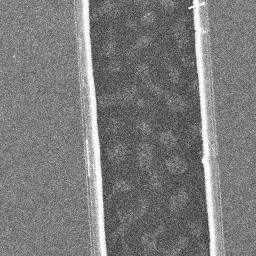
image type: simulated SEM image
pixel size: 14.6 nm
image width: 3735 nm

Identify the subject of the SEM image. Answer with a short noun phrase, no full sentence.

one or a few lines or trenches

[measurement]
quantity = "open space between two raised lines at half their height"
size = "1570 nm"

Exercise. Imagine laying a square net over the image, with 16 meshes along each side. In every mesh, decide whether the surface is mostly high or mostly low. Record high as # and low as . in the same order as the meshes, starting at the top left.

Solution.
#####.......####
#####.......####
######......####
######......####
######......####
######.......###
######.......###
######.......###
######.......###
######.......###
######.......###
######.......###
######.......###
######.......###
######.......###
######.......###